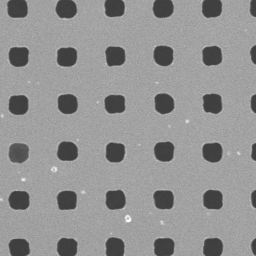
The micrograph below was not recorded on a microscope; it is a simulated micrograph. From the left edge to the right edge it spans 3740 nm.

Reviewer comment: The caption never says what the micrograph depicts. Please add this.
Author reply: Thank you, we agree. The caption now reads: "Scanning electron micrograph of a regular array of holes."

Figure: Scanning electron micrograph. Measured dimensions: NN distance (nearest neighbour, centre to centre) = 695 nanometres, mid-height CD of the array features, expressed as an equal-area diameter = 303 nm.